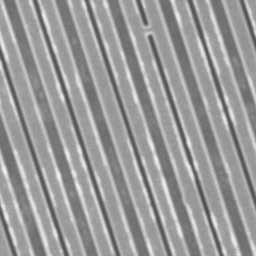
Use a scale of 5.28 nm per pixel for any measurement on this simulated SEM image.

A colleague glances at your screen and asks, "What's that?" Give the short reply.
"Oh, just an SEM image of parallel lines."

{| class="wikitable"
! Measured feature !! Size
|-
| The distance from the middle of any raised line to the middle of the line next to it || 129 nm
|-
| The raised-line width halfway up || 84.1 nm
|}